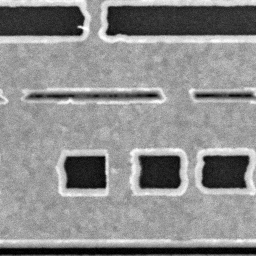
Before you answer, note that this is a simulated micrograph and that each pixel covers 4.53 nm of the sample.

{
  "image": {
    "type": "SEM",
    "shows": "one or a few lines or trenches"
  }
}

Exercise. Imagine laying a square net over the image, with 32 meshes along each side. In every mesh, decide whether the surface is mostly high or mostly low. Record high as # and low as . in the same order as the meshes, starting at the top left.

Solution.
.#........###...................
...........##...................
...........##...................
...........##...................
..........###...................
################################
################################
################################
################################
################################
################################
#########################......#
####.###########################
################################
################################
################################
################################
################################
################################
########.....####......##......#
########.....####......##......#
########.....####......##......#
########.....####......##......#
########.....####......##......#
################################
################################
################################
################################
################################
################################
####.........#....##..##..#.####
................................